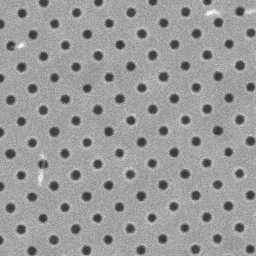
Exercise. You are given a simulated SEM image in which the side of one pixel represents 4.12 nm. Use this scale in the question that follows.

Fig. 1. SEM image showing a regular array of holes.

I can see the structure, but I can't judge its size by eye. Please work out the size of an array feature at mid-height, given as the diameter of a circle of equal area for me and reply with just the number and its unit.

42.8 nanometres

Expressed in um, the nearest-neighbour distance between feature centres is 0.099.